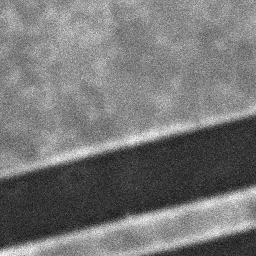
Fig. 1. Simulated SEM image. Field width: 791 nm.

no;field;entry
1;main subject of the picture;one or a few lines or trenches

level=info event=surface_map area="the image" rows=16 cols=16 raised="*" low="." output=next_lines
****************
****************
****************
****************
****************
****************
****************
**************..
**********......
******..........
**..............
................
.............***
.........*******
.....*********..
.*********......